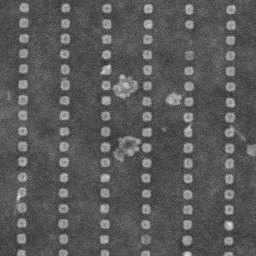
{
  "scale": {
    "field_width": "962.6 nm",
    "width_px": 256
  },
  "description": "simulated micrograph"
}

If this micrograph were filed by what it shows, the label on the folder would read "a regular array of raised bodies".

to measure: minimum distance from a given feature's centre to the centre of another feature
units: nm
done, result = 56.8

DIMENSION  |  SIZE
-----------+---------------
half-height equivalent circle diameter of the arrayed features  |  33.4 nanometers